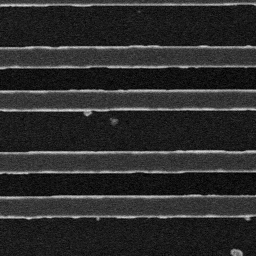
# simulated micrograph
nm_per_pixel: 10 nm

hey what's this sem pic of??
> lines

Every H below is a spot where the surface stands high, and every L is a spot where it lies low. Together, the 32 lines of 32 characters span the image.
HHHHHHHHHHHHHHHHHHHHHHHHHHHHHLLH
LLLLLLLLLLLLLLLLLLLLLLLLLLLLLLLL
LLLLLLLLLLLLLLLLLLLLLLLLLLLLLLLL
LLLLLLLLLLLLLLLLLLLLLLLLLLLLLLLL
LLLLLLLLLLLLLLLLLLLLLLLLLLLLLLLL
LLLLLLLLLLLLLLLLLLLLLLLLLLLLLLLL
HHHHHHHHHHHHHHHHHHHHHHHHHHHHHHHH
HHHHHHHHHHHHHHHHHHHHHHHHHHHHHHHH
HLLLLLLLLLLLLLLLLLLLLLLLLLLLLLLL
LLLLLLLLLLLLLLLLLLLLLLLLLLLLLLLL
LLLLLLLLLLLLLLLLLLLLLLLLLLLLLLLL
HHHHHHHHHHHHHHHHHHHHHHHHHHHHHHHH
HHHHHHHHHHHHHHHHHHHHHHHHHHHHHHHH
HHHHHHHHHHHHHHHHHHHHHHHHHHHHHHHH
LLLLLLLLLLLLLLLLLLLLLLLLLLLLLLLL
LLLLLLLLLLLLLLLLLLLLLLLLLLLLLLLL
LLLLLLLLLLLLLLLLLLLLLLLLLLLLLLLL
LLLLLLLLLLLLLLLLLLLLLLLLLLLLLLLL
LLLLLLLLLLLLLLLLLLLLLLLLLLLLLLLL
HHHHHHHHHHHHHHHHHHHHHHHHHHHHHHHH
HHHHHHHHHHHHHHHHHHHHHHHHHHHHHHHH
HHHHHHHHHHHHHHHHHLHHHHHLLLLLLLLL
LLLLLLLLLLLLLLLLLLLLLLLLLLLLLLLL
LLLLLLLLLLLLLLLLLLLLLLLLLLLLLLLL
LLLLLLLLLLLLLLLLLLLLLLLHHLHLLLLL
HHHHHHHHHHHHHHHHHHHHHHHHHHHHHHHH
HHHHHHHHHHHHHHHHHHHHHHHHHHHHHHHH
LLLLLLLLLLLLLLLLLLLLLLLLLLLLLLLL
LLLLLLLLLLLLLLLLLLLLLLLLLLLLLLLL
LLLLLLLLLLLLLLLLLLLLLLLLLLLLLLLL
LLLLLLLLLLLLLLLLLLLLLLLLLLLLLLLL
LLLLLLLLLLLLLLLLLLLLLLLLLLLLLLLL